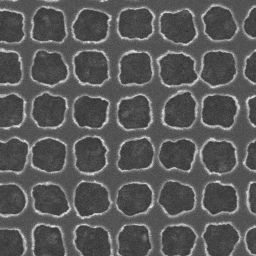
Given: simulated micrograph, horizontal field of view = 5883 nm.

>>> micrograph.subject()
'a regular array of holes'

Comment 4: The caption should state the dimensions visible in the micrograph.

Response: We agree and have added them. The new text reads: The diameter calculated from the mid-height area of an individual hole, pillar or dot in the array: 794 nm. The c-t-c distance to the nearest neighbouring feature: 953 nm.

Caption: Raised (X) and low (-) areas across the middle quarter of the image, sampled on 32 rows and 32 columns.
-XX--------XXX--------XX--------
-XX--------XXX--------XX--------
-XX--------XXX--------XX--------
-XXX-------XXX--------XX--------
XXXXX-----XXXX-------XXXX-------
XXXXXXXXXXXXXXXXXXXXXXXXXXXXXXXX
XXXXXXXXXXXXXXXXXXXXXXXXXXXXXXXX
XXXXXXXXXXXXXXXXXXXXXXXXXXXXX---
XXXX-----XXXXXXXX----XXXXXX-----
-XX--------XXX-------XXXXX------
-X---------XXX-------XXXX-------
XX---------XXX--------XXX-------
XX---------XX---------XXX-------
XXX--------XXX--------XXX-------
XXX-------XXXX--------XXX-------
XXXX-X----XXXXX------XXXXX------
XXXXXXXXXXXXXXXXXXXXXXXXXXXXXXXX
XXXXXXXXXXXXXXXXXXXXXXXXXXXXXXXX
XXXXX---XXXXXXXXXXXXXXXXXXXXXXXX
XXX-------XXXXXX-----XXXX--X----
XXX-------XXXXX-------XX--------
-XX--------XXX--------XX--------
-XX-------XXXX--------XX--------
XXX-------XXXX--------XX--------
XXX--------XXX--------XX--------
XXX-------XXXX-------XXXX-------
XXXX-----XXXXX--XXXXXXXXXXXXX--X
XXXXXXXXXXXXXXXXXXXXXXXXXXXXXXXX
XXXXXXXXXXXXXXXXXXXXXXXXXXXXXXXX
XXXXX-XXXXXXXXXXXXXXXXXXXX--XXXX
XXXX------XXXXX------XXXX------X
XXX--------XXX--------XX--------